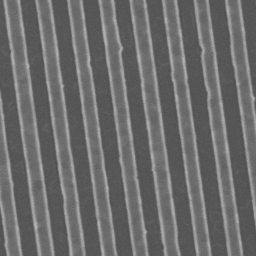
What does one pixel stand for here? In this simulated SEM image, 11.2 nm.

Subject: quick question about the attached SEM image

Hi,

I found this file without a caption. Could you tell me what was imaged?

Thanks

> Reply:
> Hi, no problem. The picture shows parallel lines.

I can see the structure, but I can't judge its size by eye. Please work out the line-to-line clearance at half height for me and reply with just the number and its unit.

192 nm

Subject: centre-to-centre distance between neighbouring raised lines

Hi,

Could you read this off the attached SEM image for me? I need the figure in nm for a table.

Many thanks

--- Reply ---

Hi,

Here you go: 352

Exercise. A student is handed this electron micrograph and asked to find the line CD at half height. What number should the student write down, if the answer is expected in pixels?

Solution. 14.1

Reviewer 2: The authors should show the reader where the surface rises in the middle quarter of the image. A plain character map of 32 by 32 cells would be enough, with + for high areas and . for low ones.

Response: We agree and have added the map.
...+++.....+++.....+++.....+++..
....+++....++++....++++....+++..
....+++....++++....++++....++++.
....+++.....+++....++++....++++.
....+++.....+++.....+++....++++.
....+++.....+++.....+++.....+++.
....+++.....+++.....+++.....+++.
....++++....+++.....+++.....+++.
....++++....++++....+++.....+++.
.....+++....++++....++++....+++.
.....+++....++++....++++....++++
.....+++.....+++....++++....++++
.....+++.....+++.....+++....++++
.....+++.....+++.....+++.....+++
+....+++.....+++.....+++.....+++
+....++++....+++.....+++.....+++
+.....+++....++++....++++....+++
+.....+++.....+++....++++....+++
+.....+++.....+++....++++....+++
+.....+++.....+++.....+++....+++
+.....+++.....+++.....+++.....++
++....+++.....+++.....+++.....++
++....++++....+++.....+++.....++
++.....+++....++++....++++....++
++.....+++....++++....++++....++
++.....+++....++++....++++....++
++.....+++.....+++....++++....++
++.....+++.....+++.....+++.....+
+++....+++.....+++.....+++.....+
+++....++++....+++.....+++.....+
+++....++++....++++....+++.....+
+++.....+++....++++....++++....+